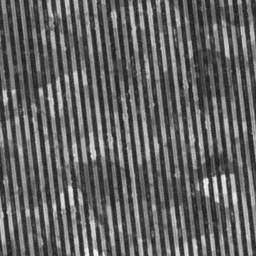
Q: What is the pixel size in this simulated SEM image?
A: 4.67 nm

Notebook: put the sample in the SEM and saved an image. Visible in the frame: parallel lines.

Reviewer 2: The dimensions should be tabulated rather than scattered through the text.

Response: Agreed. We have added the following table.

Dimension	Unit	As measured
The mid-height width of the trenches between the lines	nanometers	24.9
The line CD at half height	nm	16.2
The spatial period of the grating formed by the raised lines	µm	0.0421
